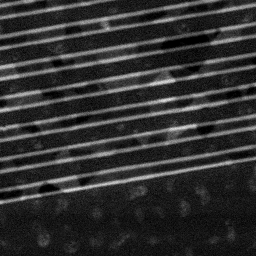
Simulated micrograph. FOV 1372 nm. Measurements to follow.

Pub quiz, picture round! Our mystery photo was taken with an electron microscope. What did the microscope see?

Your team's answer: parallel lines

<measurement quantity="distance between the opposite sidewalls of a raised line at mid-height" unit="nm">67.3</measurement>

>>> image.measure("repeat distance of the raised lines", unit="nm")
162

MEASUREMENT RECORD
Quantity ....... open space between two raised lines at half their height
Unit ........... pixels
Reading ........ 17.5